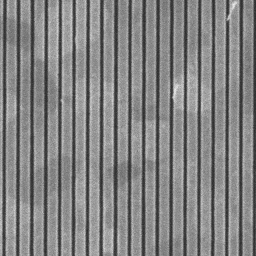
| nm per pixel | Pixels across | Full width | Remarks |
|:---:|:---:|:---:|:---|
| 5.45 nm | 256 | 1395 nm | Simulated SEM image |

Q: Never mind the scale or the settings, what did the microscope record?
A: parallel lines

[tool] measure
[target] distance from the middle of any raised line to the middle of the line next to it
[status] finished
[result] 75.9 nm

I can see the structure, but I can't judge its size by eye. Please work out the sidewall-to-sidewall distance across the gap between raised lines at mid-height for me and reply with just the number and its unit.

0.0232 micrometres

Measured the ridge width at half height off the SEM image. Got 0.0511 micrometres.